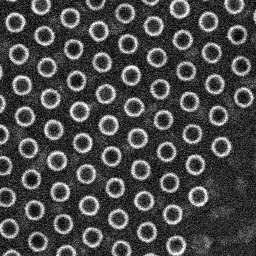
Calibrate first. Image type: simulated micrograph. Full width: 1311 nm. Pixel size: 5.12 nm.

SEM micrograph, a regular array of raised bodies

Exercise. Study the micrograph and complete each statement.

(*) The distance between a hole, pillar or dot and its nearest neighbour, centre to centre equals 160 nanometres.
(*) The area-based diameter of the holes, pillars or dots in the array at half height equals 93.4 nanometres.